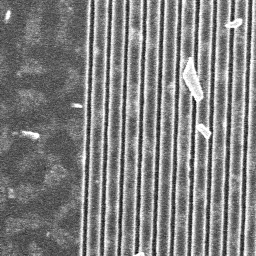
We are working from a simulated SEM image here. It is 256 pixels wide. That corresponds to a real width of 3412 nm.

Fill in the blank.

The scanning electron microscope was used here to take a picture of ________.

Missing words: parallel lines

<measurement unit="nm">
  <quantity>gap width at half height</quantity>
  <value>63.3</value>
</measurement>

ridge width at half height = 165 nanometres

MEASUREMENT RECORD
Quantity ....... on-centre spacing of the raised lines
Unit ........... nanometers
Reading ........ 234